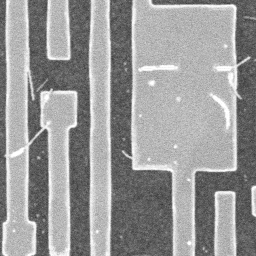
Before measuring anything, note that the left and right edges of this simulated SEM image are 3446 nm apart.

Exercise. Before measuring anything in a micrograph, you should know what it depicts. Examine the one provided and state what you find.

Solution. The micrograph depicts wiring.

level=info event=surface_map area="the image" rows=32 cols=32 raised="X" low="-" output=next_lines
-XX---XX---XXX---XX-------------
-XX---XX---XXX---XXXXXXXXXXXX---
-XX---XX---XXX---XXXXXXXXXXXX---
-XX---XXX--XXX---XXXXXXXXXXXX---
-XX---XXX--XXX---XXXXXXXXXXXX---
-XX---XXX--XXX---XXXXXXXXXXXX---
-XXX--XXX--XXX---XXXXXXXXXXXX---
-XX--------XXX---XXXXXXXXXXXX---
-XX--------XXX---XXXXXXXXXXXXX--
-XX--------XXX---XXXXXXXXXXXX---
-XX--------XXX---XXXXXXXXXXXX---
-XX---X----XXX---XXXXXXXXXXXXX--
-XX--XXXXX-XXX---XXXXXXXXXXXX---
-XX--XXXXX-XXX---XXXXXXXXXXXX---
-XX--XXXXX-XXX---XXXXXXXXXXXX---
-XX--XXXX--XXX---XXXXXXXXXXXX---
-XX---XX---XXX---XXXXXXXXXXXX---
-XX---XX---XXX---XXXXXXXXXXXX---
-XX---XX---XXX---XXXXXXXXXXXX---
-XX---XX---XXX---XXXXXXXXXXXX---
-XX---XX---XXX---XXXXXXXXXXXX---
-XX---XX---XXX-------XXXX-------
-XX---XXX--XXX--------XX--------
-XX---XXX--XXX--------XX--------
-XX---XXX--XXX--------XX---XX---
-XX---XXX--XXX--------XX---XX---
-XX---XXX--XXX--------XX---XX---
-XXX--XXX--XXX--------XX---XX---
XXXX--XXX--XXX--------XX---XX---
XXXX--XXX--XXX--------XX---XX---
XXXX--XXX--XXX--------XX---XX---
XXXX--XXX--XXX--------XX---XX---